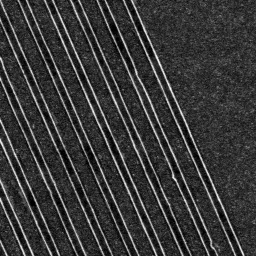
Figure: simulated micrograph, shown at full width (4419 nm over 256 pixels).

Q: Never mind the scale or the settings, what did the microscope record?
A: parallel lines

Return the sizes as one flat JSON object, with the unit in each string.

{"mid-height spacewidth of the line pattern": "275 nm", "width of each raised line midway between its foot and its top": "0.136 microns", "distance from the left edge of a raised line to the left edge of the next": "24.1 pixels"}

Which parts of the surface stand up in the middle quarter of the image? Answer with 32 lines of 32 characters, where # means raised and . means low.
..##.....##.....##....##........
...##....##.....##....###.......
...##.....##....##.....##.......
....##....##.....##....##.......
....##.....##....##.....##......
.....##....##.....##....##......
#....##....###....##.....##.....
#....##.....##.....##....##.....
#.....##....##.....##.....##....
##....##.....##.....##....##....
##.....##....##.....##....###...
.##....##.....##....##.....##...
.##.....##....##.....##....##...
..##....##.....##....##.....##..
..##....###....##.....##....##..
..##.....##.....#.....##.....##.
...##....##.....##.....#.....##.
...##.....##....##.....##....###
....##....##.....##....###....##
....##.....##....##.....##....##
.....#.....##.....##....##.....#
.....##.....##....##.....##....#
#.....##....##....###....##.....
#.....##....###....##.....##....
##....##.....##....##.....##....
##.....##....##.....##.....##...
.##....##.....##....##.....##...
.##.....##....##.....##....##...
.##.....##.....##....##....###..
..##....##.....##.....##....##..
..##.....##.....##....##....###.
...##....##.....##....##.....##.